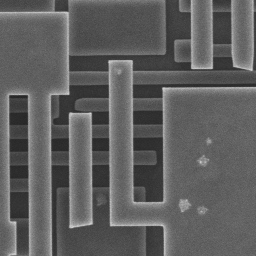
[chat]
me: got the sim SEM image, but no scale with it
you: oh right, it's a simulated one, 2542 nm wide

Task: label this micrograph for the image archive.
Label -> wiring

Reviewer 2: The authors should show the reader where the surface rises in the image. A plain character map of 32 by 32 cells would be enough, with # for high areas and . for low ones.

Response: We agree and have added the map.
........................###..###
........................###..###
########................###..###
########................###..###
########................###..###
########................###..###
########................###..###
########................###..###
#########.....###.......##....##
#########.....###...............
#########.....###...............
#########.....###...############
#...##........###...############
#...##........###...############
#...##...##...###...############
#...##...##...###...############
#...##...##...###...############
#...##...##...###...############
#...##...##...###...############
#...##...##...###...############
#...##...##...###...############
#...##...##...###...############
#...##...##...###...############
#...##...###..###...############
#...##...###..###...############
#...##...###..##################
#...##...###..##################
##..##...###..##################
##..##..............############
##..##..............############
##..##...............###########
##..##...............###########